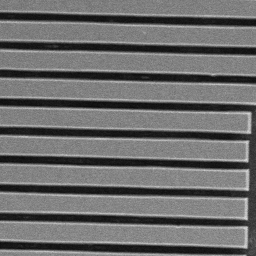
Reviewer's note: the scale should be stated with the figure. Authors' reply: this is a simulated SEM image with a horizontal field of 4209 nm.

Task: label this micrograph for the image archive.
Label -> parallel lines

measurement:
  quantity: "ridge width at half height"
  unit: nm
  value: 327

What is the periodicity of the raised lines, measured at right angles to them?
0.47 um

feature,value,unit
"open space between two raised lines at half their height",8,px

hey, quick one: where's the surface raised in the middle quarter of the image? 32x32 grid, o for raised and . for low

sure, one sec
oooooooooooooooooooooooooooooooo
oooooooooooooooooooooooooooooooo
................................
................................
ooooooooooooooooooo.oo..o.......
oooooooooooooooooooooooooooooooo
oooooooooooooooooooooooooooooooo
oooooooooooooooooooooooooooooooo
oooooooooooooooooooooooooooooooo
...........................ooooo
................................
oooooooooooooooooo..............
oooooooooooooooooooooooooooooooo
oooooooooooooooooooooooooooooooo
oooooooooooooooooooooooooooooooo
oooooooooooooooooooooooooooooooo
...................oooooo.oooooo
................................
o.....ooooo.....................
oooooooooooooooooooooooooooooooo
oooooooooooooooooooooooooooooooo
oooooooooooooooooooooooooooooooo
oooooooooooooooooooooooooooooooo
..............oooooooooooooooooo
................................
ooo.............................
oooooooooooooooooooooooooooooooo
oooooooooooooooooooooooooooooooo
oooooooooooooooooooooooooooooooo
oooooooooooooooooooooooooooooooo
.............ooooooooooooooooooo
................................